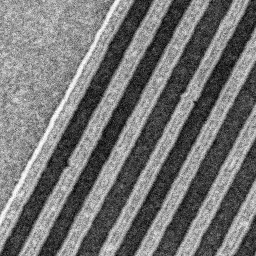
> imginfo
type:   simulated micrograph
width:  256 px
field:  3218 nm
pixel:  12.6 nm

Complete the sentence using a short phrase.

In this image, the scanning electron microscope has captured parallel lines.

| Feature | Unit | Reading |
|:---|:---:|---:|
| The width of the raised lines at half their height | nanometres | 160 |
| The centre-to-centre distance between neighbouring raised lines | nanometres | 432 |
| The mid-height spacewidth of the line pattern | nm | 265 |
